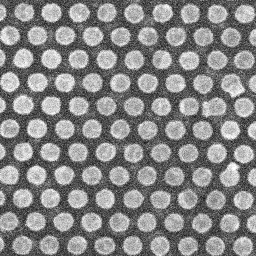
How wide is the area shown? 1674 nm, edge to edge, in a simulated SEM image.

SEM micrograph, a regular array of raised bodies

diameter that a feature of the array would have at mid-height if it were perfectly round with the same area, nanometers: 118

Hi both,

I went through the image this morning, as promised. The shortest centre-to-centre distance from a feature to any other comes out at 0.175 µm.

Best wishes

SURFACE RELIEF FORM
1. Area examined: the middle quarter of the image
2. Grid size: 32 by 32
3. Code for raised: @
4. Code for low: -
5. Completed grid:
--@@@----@@@----@@@----@@@----@@
--------------------------------
@-------------------------------
@@---@@@@---@@@@---@@@@---@@@@--
@@---@@@@---@@@@---@@@@---@@@@--
@@---@@@@---@@@@---@@@@---@@@@--
@@----@@-----@@----@@@-----@@---
--------------------------------
---@------@---------------------
--@@@@---@@@----@@@---@@@@---@@@
-@@@@@--@@@@@--@@@@@--@@@@@--@@@
--@@@@---@@@@--@@@@@--@@@@@--@@@
---@@-----@@----@@@----@@-----@@
--------------------------------
@-----@@-----@@------------@@---
@@---@@@@---@@@@---@@@@---@@@@--
@@---@@@@---@@@@---@@@@---@@@@--
@@---@@@@---@@@@---@@@@---@@@@--
-------------@@-----@@-----@@---
--------------------------------
--@@@----@@@----@@@----@@-----@@
-@@@@@--@@@@@--@@@@@--@@@@---@@@
-@@@@@--@@@@@--@@@@@--@@@@---@@@
--@@@----@@@----@@@---@@@@---@@@
--------------------------------
--------------------------------
@@---@@@@---@@@----@@@----@@@---
@@---@@@@---@@@@--@@@@@---@@@@--
@@---@@@@---@@@@--@@@@@--@@@@@--
@----@@@----@@@@---@@@----@@@---
--------------------------------
--------------------------------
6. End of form